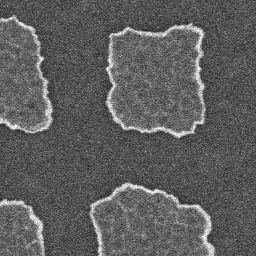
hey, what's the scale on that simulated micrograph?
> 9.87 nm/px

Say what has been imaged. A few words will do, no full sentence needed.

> raised bodies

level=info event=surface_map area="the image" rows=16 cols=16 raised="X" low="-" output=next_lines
----------------
X---------------
XX-----XXXXXX---
XXX----XXXXX----
XXX----XXXXX----
XXX----XXXXXX---
XXX----XXXXXX---
XXX----XXXXXX---
----------------
----------------
----------------
----------------
------XXXXX-----
XX----XXXXXXX---
XXX---XXXXXXX---
XXX---XXXXXXX---